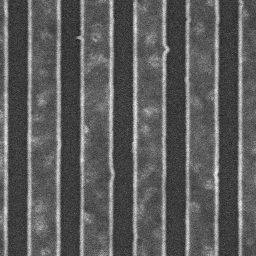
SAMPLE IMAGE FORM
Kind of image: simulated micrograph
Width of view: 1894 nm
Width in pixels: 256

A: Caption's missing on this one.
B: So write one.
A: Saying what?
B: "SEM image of parallel lines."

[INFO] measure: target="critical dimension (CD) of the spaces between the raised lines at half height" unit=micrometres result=0.167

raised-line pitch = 390 nanometers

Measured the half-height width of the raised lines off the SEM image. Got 221 nanometers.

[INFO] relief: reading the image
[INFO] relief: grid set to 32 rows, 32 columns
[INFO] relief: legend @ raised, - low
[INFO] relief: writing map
@---@@@---@@@@---@@@@--@@@@---@@
@---@@@---@@@@---@@@@--@@@@---@@
@---@@@---@@@@---@@@@--@@@@---@@
@---@@@---@@@@---@@@@--@@@@---@@
@---@@@---@@@@---@@@@--@@@@---@@
@---@@@---@@@@---@@@@--@@@@---@@
@---@@@---@@@@---@@@@--@@@@---@@
@---@@@---@@@@---@@@@--@@@@---@@
@---@@@---@@@@---@@@@--@@@@---@@
@---@@@---@@@@---@@@@--@@@@---@@
@---@@@---@@@@---@@@@--@@@@---@@
@---@@@---@@@@---@@@@--@@@@---@@
@---@@@---@@@@---@@@@---@@@---@@
@---@@@---@@@@---@@@@---@@@---@@
@---@@@---@@@@---@@@@---@@@---@@
@---@@@---@@@@---@@@@---@@@---@@
@---@@@---@@@@---@@@@---@@@---@@
@---@@@---@@@@---@@@@---@@@---@@
@---@@@---@@@@---@@@@---@@@---@@
@---@@@---@@@@---@@@@--@@@@---@@
@---@@@---@@@@---@@@@--@@@@---@@
@---@@@---@@@@---@@@@--@@@@---@@
@---@@@---@@@@---@@@@--@@@@---@@
@---@@@---@@@@---@@@---@@@@---@@
@---@@@---@@@@---@@@@--@@@@---@@
@---@@@---@@@@---@@@@--@@@@---@@
@---@@@---@@@@---@@@@--@@@@---@@
@---@@@---@@@@---@@@@--@@@@---@@
@---@@@---@@@@---@@@@--@@@@---@@
@---@@@---@@@@---@@@@--@@@@---@@
@---@@@---@@@@---@@@@--@@@@---@@
@---@@@---@@@@---@@@@--@@@@---@@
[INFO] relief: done